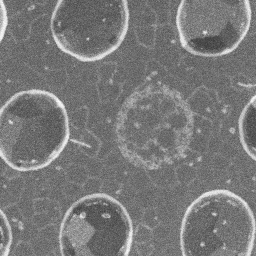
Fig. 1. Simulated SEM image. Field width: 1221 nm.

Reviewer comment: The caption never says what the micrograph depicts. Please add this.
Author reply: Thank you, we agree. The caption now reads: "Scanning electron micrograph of raised bodies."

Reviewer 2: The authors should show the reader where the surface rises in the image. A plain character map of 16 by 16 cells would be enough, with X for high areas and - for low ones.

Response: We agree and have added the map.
----XXXX---XXXXX
---XXXXX---XXXXX
---XXXXX---XXXX-
-----X----------
----------------
----------------
XXXX------------
XXXX-----------X
XXXX-----------X
XXXX------------
-X--------------
----------------
-----XX-----XXX-
----XXXX----XXXX
X---XXXX---XXXXX
X---XXXX---XXXXX